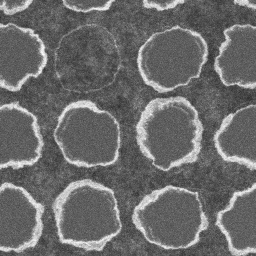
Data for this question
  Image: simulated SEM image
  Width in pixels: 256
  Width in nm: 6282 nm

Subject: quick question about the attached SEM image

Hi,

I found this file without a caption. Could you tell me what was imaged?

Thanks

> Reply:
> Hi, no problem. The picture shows raised bodies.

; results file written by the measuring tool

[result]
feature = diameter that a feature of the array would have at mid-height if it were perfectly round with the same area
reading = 1560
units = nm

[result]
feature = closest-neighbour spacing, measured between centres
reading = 1930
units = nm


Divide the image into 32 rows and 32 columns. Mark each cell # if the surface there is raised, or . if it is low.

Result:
###.....######....####.........#
.#..............................
................................
##....................#......###
#####..............######...####
#####.............########..####
######...........#########..####
######...........#########.#####
#####.............#######..#####
###...............#######...####
###................####.....####
................................
.....................##.........
##.......###.......#####......##
####....######....#######....###
####...########..########...####
#####..########...#######..#####
#####..########...#######..#####
#####...#######...######...#####
#####...#######....#####....####
#..........###.....###.........#
................................
................................
##.......####........##........#
###.....######......#####....###
####...########...#######....###
#####..########..########...####
#####..########..########..#####
#####..########...#######...####
#####...######....#######...####
###........#........####.....###
................................